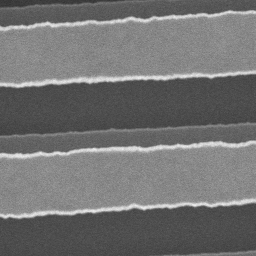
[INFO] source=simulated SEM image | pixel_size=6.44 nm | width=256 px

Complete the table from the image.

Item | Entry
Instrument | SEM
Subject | lines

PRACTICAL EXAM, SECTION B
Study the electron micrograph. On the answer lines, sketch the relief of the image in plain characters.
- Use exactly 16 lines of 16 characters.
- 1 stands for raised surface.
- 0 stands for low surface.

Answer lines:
1111111111111111
1111111111111111
1111111111111111
1111111111111111
1111111111111111
0000000000000000
0000000000000000
0000000000000000
1111111111111111
1111111111111111
1111111111111111
1111111111111111
1111111111111111
1100000000000000
0000000000000000
0000000000000000